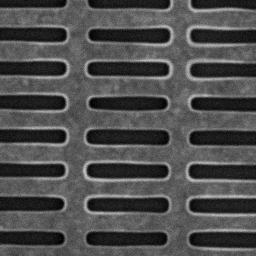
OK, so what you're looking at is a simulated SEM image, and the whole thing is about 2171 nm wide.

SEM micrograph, groups of lines, slits or small figures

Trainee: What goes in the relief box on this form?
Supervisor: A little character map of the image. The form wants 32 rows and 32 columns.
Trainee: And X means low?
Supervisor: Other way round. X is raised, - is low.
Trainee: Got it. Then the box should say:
--------XXX----------XXX--------
XXXXXXXXXXXXXXXXXXXXXXXXXXXXXXXX
XXXXXXXXXXXXXXXXXXXXXXXXXXXXXXXX
--------XXXX---------XXX---XXXXX
--------XXX-----------XX--------
XXXXX--XXXXXXXXXX----XXX--------
XXXXXXXXXXXXXXXXXXXXXXXXXXXXXXXX
XXXXX-XXXXXXXXXXXXXXXXXXXXXXXXXX
--------XXX----------XXX--------
--------XXX----------XXX--------
XXXXXXXXXXXXXXXXXXXXXXXXXXXXXXXX
XXXXXXXXXXXXXXXXXXXXXXXXXXXXXXXX
--------XXX----------XXX--------
--------XXX----------XXX--------
XXXXXXXXXXXXXXXXXXXXXXXXXXXXXXXX
XXXXXXXXXXXXXXXXXXXXXXXXXXXXXXXX
--------XXX----------XXX--------
--------XXX----------XXX--------
XXXXXXXXXXXXXXXXXXXXXXXXXXXXXXXX
XXXXXXXXXXXXXXXXXXXXXXXXXXXXXXXX
--------XXX---------XXXX-------X
--------XXX----------XX---------
XXXXXXXXXXXXX---XXXXXXXX--------
XXXXXXXXXXXXXXXXXXXXXXXXXXXXXXXX
-------XXXXX---XXXXXXXXXXXXXXXXX
--------XXX----------XXX--------
XXXXXXXXXXXX---------XXX--------
XXXXXXXXXXXXXXXXXXXXXXXXXXXXXXXX
XXXXXXXXXXXXXXXXXXXXXXXXXXXXXXXX
--------XXX----------XXX--------
--------XXX----------XXX--------
XXXXXXXXXXXXXXXXXXXXXXXXXXXXXXXX